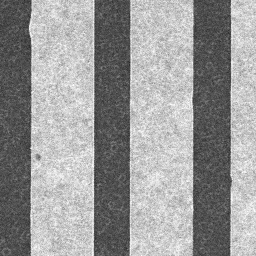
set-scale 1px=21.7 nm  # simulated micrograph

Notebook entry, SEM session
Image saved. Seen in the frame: one or a few lines or trenches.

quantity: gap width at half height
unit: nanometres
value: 825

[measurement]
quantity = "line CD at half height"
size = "1360 nanometres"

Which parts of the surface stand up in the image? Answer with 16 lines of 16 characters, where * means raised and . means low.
..****..****..**
..****..****..**
..****..****..**
..****..****..**
..****..****..**
..****..****..**
..****..****..**
..****..****..**
..****..****..**
..****..****..**
..****..****..**
..****..****..**
..****..****..**
..****..****..**
..****..****..**
..****..****..**